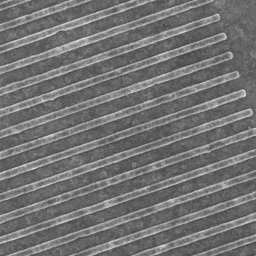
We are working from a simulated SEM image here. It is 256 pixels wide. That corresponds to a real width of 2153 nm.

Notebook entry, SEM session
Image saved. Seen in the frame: parallel lines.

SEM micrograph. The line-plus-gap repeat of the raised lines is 169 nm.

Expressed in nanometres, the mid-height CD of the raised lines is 58.6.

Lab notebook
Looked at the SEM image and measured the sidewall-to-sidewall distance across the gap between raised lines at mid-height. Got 112 nanometers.